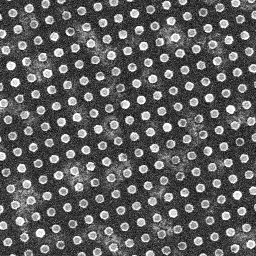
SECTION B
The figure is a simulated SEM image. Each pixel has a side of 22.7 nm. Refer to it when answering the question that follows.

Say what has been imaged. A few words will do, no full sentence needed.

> a regular array of raised bodies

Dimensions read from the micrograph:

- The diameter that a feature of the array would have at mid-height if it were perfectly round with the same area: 172 nanometers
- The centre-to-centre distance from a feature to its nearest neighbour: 374 nanometres